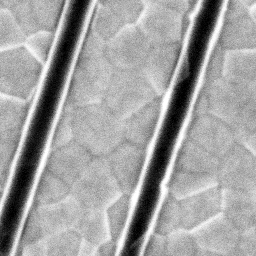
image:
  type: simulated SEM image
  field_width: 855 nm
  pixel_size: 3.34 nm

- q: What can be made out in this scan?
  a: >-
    one or a few lines or trenches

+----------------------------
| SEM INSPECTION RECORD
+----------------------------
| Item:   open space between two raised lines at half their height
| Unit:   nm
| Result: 328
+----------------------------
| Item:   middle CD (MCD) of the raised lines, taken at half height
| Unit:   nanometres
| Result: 90.1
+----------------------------